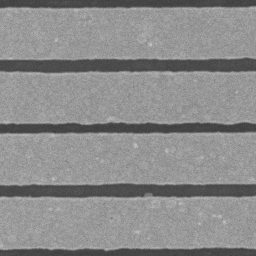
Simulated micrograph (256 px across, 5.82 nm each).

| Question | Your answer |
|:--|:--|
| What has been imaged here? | lines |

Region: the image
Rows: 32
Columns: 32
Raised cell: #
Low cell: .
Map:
................................
################################
################################
################################
################################
################################
################################
.........#......................
................................
################################
################################
################################
################################
################################
################################
.......#..##........##......#...
................................
################################
################################
################################
################################
################################
################################
................................
................................
################################
################################
################################
################################
################################
################################
................................